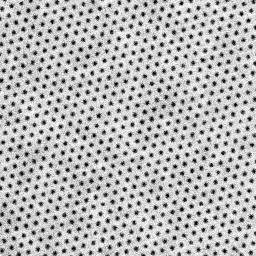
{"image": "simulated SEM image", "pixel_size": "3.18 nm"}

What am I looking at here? a regular array of holes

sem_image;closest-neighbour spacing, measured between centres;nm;30.6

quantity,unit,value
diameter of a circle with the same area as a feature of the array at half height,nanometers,16.8